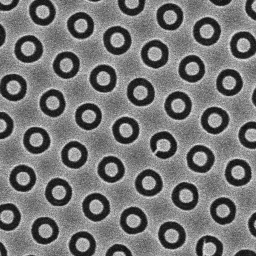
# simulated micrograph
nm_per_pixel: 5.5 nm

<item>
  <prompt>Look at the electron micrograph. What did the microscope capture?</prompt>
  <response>a regular array of ring-shaped grooves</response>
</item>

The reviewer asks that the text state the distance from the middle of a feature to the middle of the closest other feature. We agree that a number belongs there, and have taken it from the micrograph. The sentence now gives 218 nm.